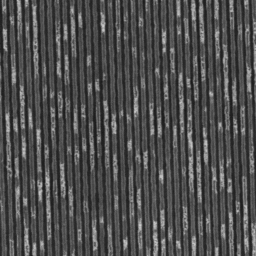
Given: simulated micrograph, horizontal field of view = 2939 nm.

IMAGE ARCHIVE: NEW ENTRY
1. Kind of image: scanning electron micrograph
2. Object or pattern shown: parallel lines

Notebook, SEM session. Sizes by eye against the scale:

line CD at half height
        43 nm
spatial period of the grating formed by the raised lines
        87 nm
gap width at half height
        0.043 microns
